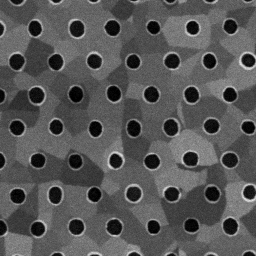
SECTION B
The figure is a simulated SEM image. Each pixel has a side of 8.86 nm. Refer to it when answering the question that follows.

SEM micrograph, a regular array of holes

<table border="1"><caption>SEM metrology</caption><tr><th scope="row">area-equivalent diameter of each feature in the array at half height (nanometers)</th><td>138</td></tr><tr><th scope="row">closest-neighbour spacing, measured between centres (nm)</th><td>330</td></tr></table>